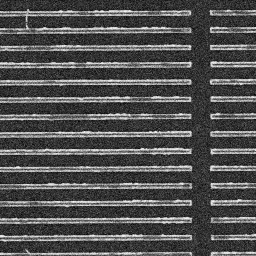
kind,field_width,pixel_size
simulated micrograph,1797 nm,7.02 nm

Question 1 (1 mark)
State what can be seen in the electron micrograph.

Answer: parallel lines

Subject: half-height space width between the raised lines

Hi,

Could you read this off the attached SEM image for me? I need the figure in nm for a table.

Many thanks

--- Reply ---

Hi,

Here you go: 86.8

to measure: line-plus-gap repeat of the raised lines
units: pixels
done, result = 17.3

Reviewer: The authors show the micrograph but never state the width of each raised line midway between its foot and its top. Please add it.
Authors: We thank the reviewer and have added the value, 0.0324 um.